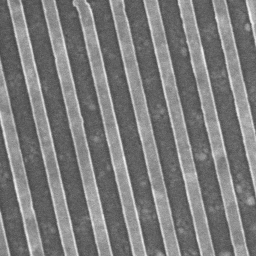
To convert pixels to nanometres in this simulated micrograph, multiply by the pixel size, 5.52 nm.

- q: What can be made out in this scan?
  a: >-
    parallel lines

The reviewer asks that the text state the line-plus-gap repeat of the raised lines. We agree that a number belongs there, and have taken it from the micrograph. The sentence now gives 183 nanometers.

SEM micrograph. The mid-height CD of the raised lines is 11.9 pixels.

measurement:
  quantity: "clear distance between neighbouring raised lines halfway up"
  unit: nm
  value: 118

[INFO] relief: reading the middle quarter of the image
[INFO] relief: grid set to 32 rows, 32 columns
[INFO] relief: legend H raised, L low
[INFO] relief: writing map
HLLLLLLHHHLLLLLHHHLLLLLLHHHLLLLL
HHLLLLLHHHLLLLLHHHHLLLLLHHHLLLLL
HHLLLLLHHHLLLLLLHHHLLLLLHHHLLLLL
HHLLLLLLHHHLLLLLHHHLLLLLLHHHLLLL
HHLLLLLLHHHLLLLLHHHLLLLLLHHHLLLL
HHLLLLLLHHHLLLLLHHHLLLLLLHHHLLLL
HHHLLLLLHHHLLLLLLHHHLLLLLHHHLLLL
HHHLLLLLHHHLLLLLLHHHLLLLLHHHLLLL
HHHLLLLLLHHHLLLLLHHHLLLLLHHHHLLL
HHHLLLLLLHHHLLLLLHHHLLLLLLHHHLLL
LHHHLLLLLHHHLLLLLHHHHLLLLLHHHLLL
LHHHLLLLLHHHLLLLLLHHHLLLLLHHHLLL
LHHHLLLLLLHHHLLLLLHHHLLLLLHHHHLL
LHHHLLLLLLHHHLLLLLHHHLLLLLLHHHLL
LHHHHLLLLLHHHLLLLLHHHHLLLLLHHHLL
LLHHHLLLLLHHHLLLLLLHHHLLLLLHHHLL
LLHHHLLLLLHHHLLLLLLHHHLLLLLLHHLL
LLHHHLLLLLLHHHLLLLLHHHLLLLLLHHHL
LLHHHLLLLLLHHHLLLLLHHHLLLLLLHHHL
LLLHHHLLLLLHHHLLLLLLHHHLLLLLHHHL
LLLHHHLLLLLHHHLLLLLLHHHLLLLLHHHL
LLLHHHLLLLLLHHHLLLLLHHHLLLLLHHHH
LLLHHHLLLLLLHHHLLLLLHHHLLLLLLHHH
LLLHHHLLLLLLHHHLLLLLHHHHLLLLLHHH
LLLLHHHLLLLLHHHLLLLLLHHHLLLLLHHH
LLLLHHHLLLLLHHHLLLLLLHHHLLLLLHHH
LLLLHHHLLLLLLHHHLLLLLHHHLLLLLLHH
LLLLHHHLLLLLLHHHLLLLLHHHLLLLLLHH
LLLLLHHHLLLLLHHHLLLLLHHHHLLLLLHH
LLLLLHHHLLLLLHHHLLLLLLHHHLLLLLHH
LLLLLHHHLLLLLLHHHLLLLLHHHLLLLLLH
LLLLLHHHLLLLLLHHHLLLLLHHHLLLLLLH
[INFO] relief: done